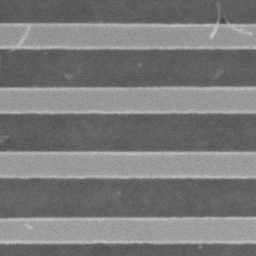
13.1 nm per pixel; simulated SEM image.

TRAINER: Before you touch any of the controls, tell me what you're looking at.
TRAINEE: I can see lines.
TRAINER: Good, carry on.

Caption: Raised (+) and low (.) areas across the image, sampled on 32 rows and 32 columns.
................................
................................
................................
++++++++++++++++++++++++++++++++
++++++++++++++++++++++++++++++++
++++++++++++++++++++++++++++++++
................................
................................
................................
................................
................................
++++++++++++++++++++++++++++++++
++++++++++++++++++++++++++++++++
++++++++++++++++++++++++++++++++
................................
................................
................................
................................
................................
++++++++++++++++++++++++++++++++
++++++++++++++++++++++++++++++++
++++++++++++++++++++++++++++++++
................................
................................
................................
................................
................................
++++++++++++++++++++++++++++++++
++++++++++++++++++++++++++++++++
++++++++++++++++++++++++++++++++
................................
................................